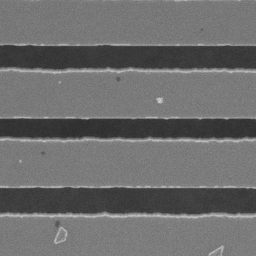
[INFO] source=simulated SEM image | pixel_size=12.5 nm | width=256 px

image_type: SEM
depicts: lines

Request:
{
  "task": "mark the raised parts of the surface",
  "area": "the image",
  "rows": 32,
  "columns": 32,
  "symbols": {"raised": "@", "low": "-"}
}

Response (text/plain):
@@@@@@@@@@@@@@@@@@@@@@@@@@@@@@@@
@@@@@@@@@@@@@@@@@@@@@@@@@@@@@@@@
@@@@@@@@@@@@@@@@@@@@@@@@@@@@@@@@
@@@@@@@@@@@@@@@@@@@@@@@@@@@@@@@@
@@@@@@@@@@@@@@@@@@@@@@@@@@@@@@@@
@@@@@@@@@@@@@@@@@@@@@@@@@@@@@@@@
--------------------------------
--------------------------------
--------------------------------
@@@@@@@@@@@@@@@@@@@@@@@@@@@@@@@@
@@@@@@@@@@@@@@@@@@@@@@@@@@@@@@@@
@@@@@@@@@@@@@@@@@@@@@@@@@@@@@@@@
@@@@@@@@@@@@@@@@@@@@@@@@@@@@@@@@
@@@@@@@@@@@@@@@@@@@@@@@@@@@@@@@@
@@@@@@@@@@@@@@@@@@@@@@@@@@@@@@@@
--------------------------------
--------------------------------
@@@@@@@@@@@@@@@@@@@@@@@@@@@@@@@@
@@@@@@@@@@@@@@@@@@@@@@@@@@@@@@@@
@@@@@@@@@@@@@@@@@@@@@@@@@@@@@@@@
@@@@@@@@@@@@@@@@@@@@@@@@@@@@@@@@
@@@@@@@@@@@@@@@@@@@@@@@@@@@@@@@@
@@@@@@@@@@@@@@@@@@@@@@@@@@@@@@@@
------------------------------@@
--------------------------------
--------------------------------
--------------------------------
@@@@@@@@@@@@@@@@@@@@@@@@@@@@@@@@
@@@@@@@@@@@@@@@@@@@@@@@@@@@@@@@@
@@@@@@@@@@@@@@@@@@@@@@@@@@@@@@@@
@@@@@@@@@@@@@@@@@@@@@@@@@@@@@@@@
@@@@@@@@@@@@@@@@@@@@@@@@@@@@@@@@